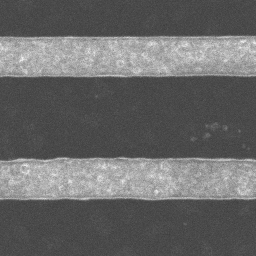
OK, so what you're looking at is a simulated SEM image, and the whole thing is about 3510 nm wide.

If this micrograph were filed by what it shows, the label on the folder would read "one or a few lines or trenches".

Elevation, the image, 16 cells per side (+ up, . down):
++++++++++++++++
++++++++++++++++
................
................
................
++++++++++++++++
++++++++++++++++
++++++++++++++++
++++++++++++++++
++++++++++++++++
................
................
++++++++++++++++
++++++++++++++++
++++++++++++++++
++++++++++++++++